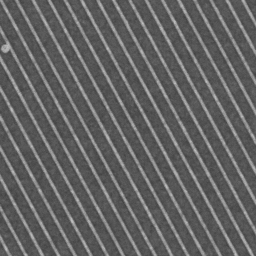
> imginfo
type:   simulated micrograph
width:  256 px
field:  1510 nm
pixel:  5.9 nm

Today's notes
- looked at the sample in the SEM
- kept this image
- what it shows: parallel lines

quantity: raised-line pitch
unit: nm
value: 83.8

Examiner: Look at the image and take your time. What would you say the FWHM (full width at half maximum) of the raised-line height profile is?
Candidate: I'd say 11.7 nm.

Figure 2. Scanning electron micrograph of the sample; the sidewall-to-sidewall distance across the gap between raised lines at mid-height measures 0.0693 µm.